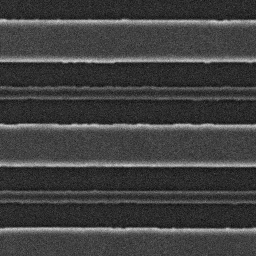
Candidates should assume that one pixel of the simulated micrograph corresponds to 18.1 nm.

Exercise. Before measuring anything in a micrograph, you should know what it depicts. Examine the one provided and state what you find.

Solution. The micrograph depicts lines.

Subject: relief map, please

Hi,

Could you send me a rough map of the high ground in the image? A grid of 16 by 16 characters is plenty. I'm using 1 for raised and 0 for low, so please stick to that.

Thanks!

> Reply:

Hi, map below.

0000000000000000
1111111111111111
1111111111111111
1111111111111111
0000000000000000
0000000000000000
0000000000000000
0000000000000000
1111111111111111
1111111111111111
0000000000000000
0000000000000000
0000000000000000
0000000000000000
1111111111111111
1111111111111111